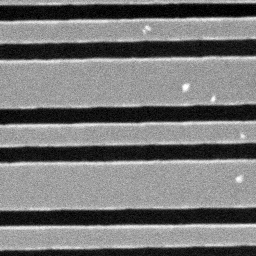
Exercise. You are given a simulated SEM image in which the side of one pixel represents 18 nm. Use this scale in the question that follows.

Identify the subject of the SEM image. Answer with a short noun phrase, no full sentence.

lines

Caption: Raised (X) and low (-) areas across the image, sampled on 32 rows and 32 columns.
XXXXXXXXXXXX--------------------
--------------------------------
----------------XXXXXXXXXXXXXXXX
XXXXXXXXXXXXXXXXXXXXXXXXXXXXXXXX
XXXXXXXXXXXXXXXXXXXXXXXXXXXXXXXX
--------------------------------
--------------------------------
--------XXXXXXXXXXXXXXXXXXXXXXXX
XXXXXXXXXXXXXXXXXXXXXXXXXXXXXXXX
XXXXXXXXXXXXXXXXXXXXXXXXXXXXXXXX
XXXXXXXXXXXXXXXXXXXXXXXXXXXXXXXX
XXXXXXXXXXXXXXXXXXXXXXXXXXXXXXXX
XXXXXXXXXXXXXXXXXXXXXXXXXXXXXXXX
XXXXX---------------------------
--------------------------------
---------XXXXXXXXXXXXXXXXXXXXXXX
XXXXXXXXXXXXXXXXXXXXXXXXXXXXXXXX
XXXXXXXXXXXXXXXXXXXXXXXXXXXXXXXX
--------------------------------
--------------------------------
XXXXXXXXXXXXXXXXXXXXXXXXXXXXXXXX
XXXXXXXXXXXXXXXXXXXXXXXXXXXXXXXX
XXXXXXXXXXXXXXXXXXXXXXXXXXXXXXXX
XXXXXXXXXXXXXXXXXXXXXXXXXXXXXXXX
XXXXXXXXXXXXXXXXXXXXXXXXXXXXXXXX
XXXXXXXXXXXXXXXXXXXXXXXXXXXXXXXX
--------------------------------
--------------------------------
XXXXXXXXXXXXXXXXXXXXXXXXXXXXXXXX
XXXXXXXXXXXXXXXXXXXXXXXXXXXXXXXX
XXXXXXXXXXXXXXXXXXXXXXXXXXXXXXXX
--------------------------------